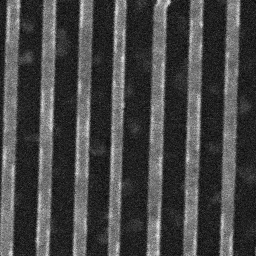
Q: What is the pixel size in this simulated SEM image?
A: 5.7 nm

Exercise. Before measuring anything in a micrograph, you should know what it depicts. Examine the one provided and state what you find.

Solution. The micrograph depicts parallel lines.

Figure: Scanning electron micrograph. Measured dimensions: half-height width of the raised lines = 66.2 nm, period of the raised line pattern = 36.7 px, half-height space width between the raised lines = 142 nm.